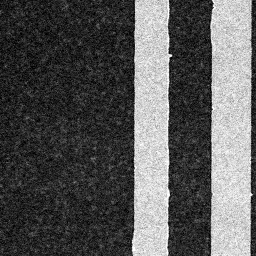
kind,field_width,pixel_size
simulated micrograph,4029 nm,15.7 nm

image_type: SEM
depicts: one or a few lines or trenches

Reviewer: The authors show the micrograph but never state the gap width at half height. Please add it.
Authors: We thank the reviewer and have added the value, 0.689 um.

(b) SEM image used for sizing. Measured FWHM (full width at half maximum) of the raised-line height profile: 561 nanometres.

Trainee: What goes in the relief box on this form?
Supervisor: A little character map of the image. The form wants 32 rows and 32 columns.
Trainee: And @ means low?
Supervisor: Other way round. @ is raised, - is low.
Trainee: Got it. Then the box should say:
-----------------@@@@------@@@@-
-----------------@@@@------@@@@-
-----------------@@@@-----@@@@@-
-----------------@@@@-----@@@@@-
-----------------@@@@-----@@@@@-
-----------------@@@@------@@@@-
-----------------@@@@------@@@@-
-----------------@@@@------@@@@-
-----------------@@@@------@@@@-
-----------------@@@@------@@@@-
-----------------@@@@-----@@@@@-
-----------------@@@@-----@@@@@-
-----------------@@@@------@@@@-
-----------------@@@@------@@@@-
-----------------@@@@------@@@@-
-----------------@@@@-----@@@@@-
-----------------@@@@------@@@@-
-----------------@@@@------@@@@-
-----------------@@@@------@@@@-
-----------------@@@@------@@@@-
-----------------@@@@------@@@@-
-----------------@@@@------@@@@-
-----------------@@@@------@@@@-
-----------------@@@@------@@@@-
-----------------@@@@------@@@@-
-----------------@@@@------@@@@-
-----------------@@@@------@@@@-
-----------------@@@@------@@@@-
-----------------@@@@-----@@@@@-
-----------------@@@@-----@@@@@-
-----------------@@@@-----@@@@@-
-----------------@@@@-----@@@@@-